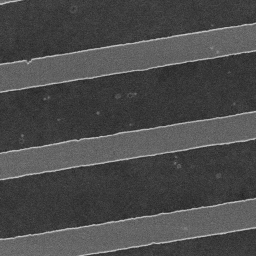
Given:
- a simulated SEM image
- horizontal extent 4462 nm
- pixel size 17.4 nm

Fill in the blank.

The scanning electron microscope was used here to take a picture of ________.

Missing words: one or a few lines or trenches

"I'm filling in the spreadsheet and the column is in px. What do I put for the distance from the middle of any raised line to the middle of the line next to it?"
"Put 86.9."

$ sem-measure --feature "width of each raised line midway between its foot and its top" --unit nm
480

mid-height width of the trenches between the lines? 1040 nm